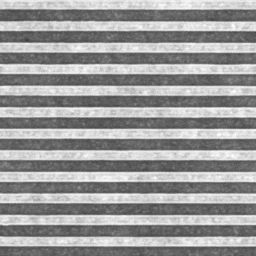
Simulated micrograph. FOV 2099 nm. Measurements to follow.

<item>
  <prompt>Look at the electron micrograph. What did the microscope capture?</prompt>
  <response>parallel lines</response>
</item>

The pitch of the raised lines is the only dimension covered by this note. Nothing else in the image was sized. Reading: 21.5 pixels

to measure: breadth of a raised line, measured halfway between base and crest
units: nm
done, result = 75.8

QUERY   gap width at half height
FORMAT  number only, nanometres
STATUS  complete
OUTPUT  104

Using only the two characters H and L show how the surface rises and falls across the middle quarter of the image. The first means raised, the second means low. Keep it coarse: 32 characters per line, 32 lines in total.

HHHHHHHHHHHHHHHHHHHHHHHHHHHHHHHH
HHHHHHHHHHHHHHHHHHHHHHHHHHHHHHHH
LLLLLLLLLLLLLLLLLLLLLLLLLLLLLLLL
LLLLLLLLLLLLLLLLLLLLLLLLLLLLLLLL
LLLLLLLLLLLLLLLLLLLLLLLLLLLLLLLL
LLLLLLLLLLLLLLLLLLLLLLLLLLLLLLLL
HHHHHHHHHHHHHHHHHHHHHHHHHHHHHHHH
HHHHHHHHHHHHHHHHHHHHHHHHHHHHHHHH
LLLLLLLLLLLLLLLLLLLLLLLLLLLLLLLL
LLLLLLLLLLLLLLLLLLLLLLLLLLLLLLLL
LLLLLLLLLLLLLLLLLLLLLLLLLLLLLLLL
HHHHHHHHHHHHHHHHHHHHHHHHHHHHHHHH
HHHHHHHHHHHHHHHHHHHHHHHHHHHHHHHH
LLLLLLLLLLLLLLLLLLLLLLLLLLLLLLLL
LLLLLLLLLLLLLLLLLLLLLLLLLLLLLLLL
LLLLLLLLLLLLLLLLLLLLLLLLLLLLLLLL
HHHHHLHHHHLLHHHHHHHHHHHLLLHHHHHH
HHHHHHHHHHHHHHHHHHHHHHHHHHHHHHHH
LLLLLLLLLLLLLLLLLLLLLLLLLLLLLLLL
LLLLLLLLLLLLLLLLLLLLLLLLLLLLLLLL
LLLLLLLLLLLLLLLLLLLLLLLLLLLLLLLL
LLLLLLLLLLLLLLLLLLLLLLLLLLLLLLLL
HHHHHHHHHHHHHHHHHHHHHHHHHHHHHHHH
HHHHHHHHHHHHHHHHHHHHHHHHHHHHHHHH
LLLLLLLLLLLLLLLLLLLLLLLLLLLLLLLL
LLLLLLLLLLLLLLLLLLLLLLLLLLLLLLLL
LLLLLLLLLLLLLLLLLLLLLLLLLLLLLLLL
HHHHHHHHHHHHHHHHHHHHHHHHHHHHHHHH
HHHHHHHHHHHHHHHHHHHHHHHHHHHHHHHH
LLLLLLLLLLLLLLLLLLLLLLLLLLLLLLLL
LLLLLLLLLLLLLLLLLLLLLLLLLLLLLLLL
LLLLLLLLLLLLLLLLLLLLLLLLLLLLLLLL